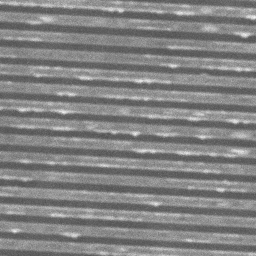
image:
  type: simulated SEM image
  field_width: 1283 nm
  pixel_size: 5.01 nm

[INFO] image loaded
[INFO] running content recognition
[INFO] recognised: parallel lines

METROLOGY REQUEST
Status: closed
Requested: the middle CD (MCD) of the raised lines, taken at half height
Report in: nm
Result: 48.1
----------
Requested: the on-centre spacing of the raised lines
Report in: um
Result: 0.0873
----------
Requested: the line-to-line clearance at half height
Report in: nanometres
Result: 38.7